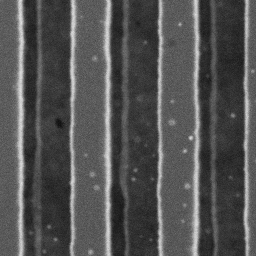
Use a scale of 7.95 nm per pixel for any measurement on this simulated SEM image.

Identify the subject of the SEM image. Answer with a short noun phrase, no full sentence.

lines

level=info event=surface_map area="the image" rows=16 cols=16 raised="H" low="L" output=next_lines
HLLLHHHLLLHHLLLH
HLLLHHHLLLHHLLLH
HLLLHHHLLLHHLLLH
HLLLHHHLLLHHLLLH
HLLLHHHLLLHHLLLH
HLLLHHHLLLHHLLLH
HLLLHHHLLLHHLLLH
HLLLHHHLLLHHLLLH
HLLLHHHLLLHHLLLH
HLLLHHHLLLHHLLLH
HLLLHHHLLLHHLLLH
HLLLHHHLLLHHLLLH
HLLLHHHLLLHHLLLH
HLLLHHHLLLHHLLLH
HLLLHHHLLLHHLLLH
HLLLHHHLLLHHLLLH